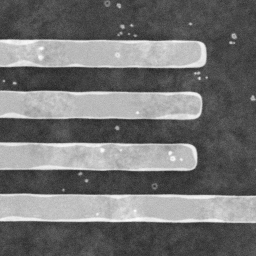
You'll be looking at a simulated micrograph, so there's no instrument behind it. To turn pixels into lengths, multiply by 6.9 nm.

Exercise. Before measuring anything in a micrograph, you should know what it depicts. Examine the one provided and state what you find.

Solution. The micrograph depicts groups of lines, slits or small figures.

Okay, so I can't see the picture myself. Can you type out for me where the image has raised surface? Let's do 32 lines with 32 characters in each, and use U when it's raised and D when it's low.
DDDDDDDDDDDDDDDDDDDDDDDDDDDDDDDD
DDDDDDDDDDDDDDDDDDDDDDDDDDDDDDDD
DDDDDDDDDDDDDDDDDDDDDDDDDDDDDDDD
DDDDDDDDDDDDDDDDDDDDDDDDDDDDDDDD
DDDDDDDDDDDDDDDDDDDDDDDDDDDDDDDD
UUUUUUUUUUUUUUUUUUUUUUUUUDDDDDDD
UUUUUUUUUUUUUUUUUUUUUUUUUDDDDDDD
UUUUUUUUUUUUUUUUUUUUUUUUUDDDDDDD
DDDDDDDDDDDDDDDDDDDDDDDDDDDDDDDD
DDDDDDDDDDDDDDDDDDDDDDDDDDDDDDDD
DDDDDDDDDDDDDDDDDDDDDDDDDDDDDDDD
UUUUUUUUUDDDDDDDDDDDDDDDDDDDDDDD
UUUUUUUUUUUUUUUUUUUUUUUUUDDDDDDD
UUUUUUUUUUUUUUUUUUUUUUUUUDDDDDDD
UDUUUUUUUUUUUUUUUUUUUUUUUDDDDDDD
DDDDDDDDDDDDDDDDDDDDDDDDDDDDDDDD
DDDDDDDDDDDDDDDDDDDDDDDDDDDDDDDD
DDDDDDDDDDDDDDDDDDDDDDDDDDDDDDDD
UUUUUUUUUUUUUUUUUUUUUUUUDDDDDDDD
UUUUUUUUUUUUUUUUUUUUUUUUDDDDDDDD
UUUUUUUUUUUUUUUUUUUUUUUUUDDDDDDD
DDDDDDDDDDDDDDDDDDDDDDDDDDDDDDDD
DDDDDDDDDDDDDDDDDDDDDDDDDDDDDDDD
DDDDDDDDDDDDDDDDDDDDDDDDDDDDDDDD
UUUUUUUUUUUUUUDUUUUUUUDDDDDDDDDD
UUUUUUUUUUUUUUUUUUUUUUUUUUUUUUUU
UUUUUUUUUUUUUUUUUUUUUUUUUUUUUUUU
UDDDUUUUUUUUDUUUUUUUUUUUUUUUUUUU
DDDDDDDDDDDDDDDDDDDDDDDDDDDDDDDD
DDDDDDDDDDDDDDDDDDDDDDDDDDDDDDDD
DDDDDDDDDDDDDDDDDDDDDDDDDDDDDDDD
DDDDDDDDDDDDDDDDDDDDDDDDDDDDDDDD